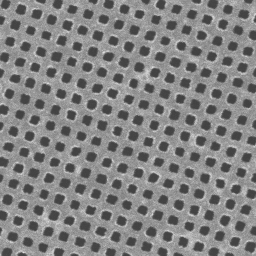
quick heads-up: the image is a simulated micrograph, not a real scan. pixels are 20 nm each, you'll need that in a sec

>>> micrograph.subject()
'a regular array of holes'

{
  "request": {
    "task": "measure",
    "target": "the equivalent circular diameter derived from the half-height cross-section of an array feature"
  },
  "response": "212 nm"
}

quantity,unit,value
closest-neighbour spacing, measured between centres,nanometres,322